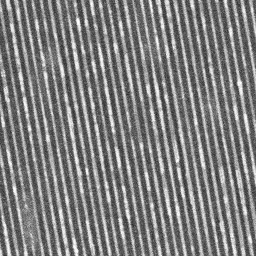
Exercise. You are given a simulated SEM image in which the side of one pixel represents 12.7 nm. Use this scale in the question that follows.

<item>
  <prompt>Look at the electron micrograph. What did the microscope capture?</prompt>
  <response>parallel lines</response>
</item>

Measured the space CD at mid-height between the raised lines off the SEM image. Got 0.0768 micrometres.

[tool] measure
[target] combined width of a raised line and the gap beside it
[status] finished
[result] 105 nm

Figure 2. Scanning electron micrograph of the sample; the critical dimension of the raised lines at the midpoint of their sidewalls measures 31.3 nm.